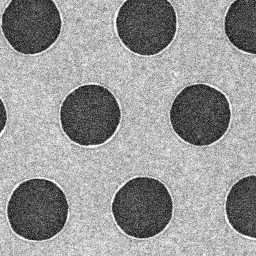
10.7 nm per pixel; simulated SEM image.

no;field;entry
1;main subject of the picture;holes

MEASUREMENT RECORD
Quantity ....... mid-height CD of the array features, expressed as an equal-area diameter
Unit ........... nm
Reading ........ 662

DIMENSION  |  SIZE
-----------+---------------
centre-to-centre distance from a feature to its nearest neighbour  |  1130 nm